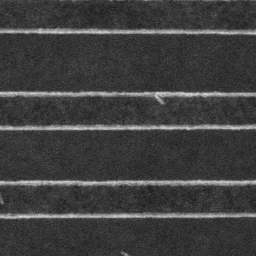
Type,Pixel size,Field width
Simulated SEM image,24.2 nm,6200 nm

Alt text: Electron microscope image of lines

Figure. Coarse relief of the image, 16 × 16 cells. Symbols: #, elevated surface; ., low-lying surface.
################
################
................
................
................
................
################
################
................
................
................
################
################
#########.#.....
................
................